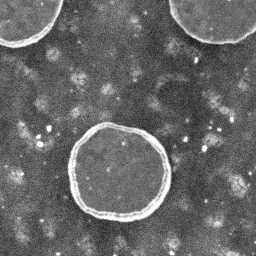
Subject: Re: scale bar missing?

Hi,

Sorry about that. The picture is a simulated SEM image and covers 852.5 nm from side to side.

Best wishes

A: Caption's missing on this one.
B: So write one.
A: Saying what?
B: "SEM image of raised bodies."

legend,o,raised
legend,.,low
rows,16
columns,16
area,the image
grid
oooo.......ooooo
ooo........ooooo
oo..........ooo.
................
................
................
................
................
.....oooo.......
.....ooooo......
....ooooooo.....
....ooooooo.....
.....ooooo......
......ooo.......
................
................